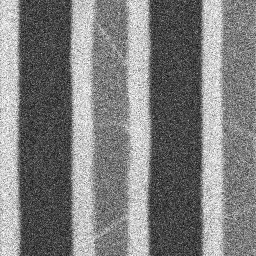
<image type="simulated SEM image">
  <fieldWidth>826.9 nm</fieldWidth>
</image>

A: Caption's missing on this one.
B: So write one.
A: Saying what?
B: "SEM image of one or a few lines or trenches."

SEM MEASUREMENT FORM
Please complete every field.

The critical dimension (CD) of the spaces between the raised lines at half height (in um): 0.235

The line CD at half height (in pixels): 57.6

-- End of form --